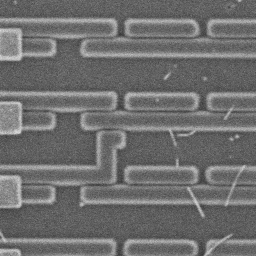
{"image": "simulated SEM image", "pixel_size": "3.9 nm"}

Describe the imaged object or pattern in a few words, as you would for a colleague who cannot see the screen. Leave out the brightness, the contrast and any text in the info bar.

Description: wiring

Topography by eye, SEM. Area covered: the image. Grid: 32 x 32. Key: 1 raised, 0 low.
00000000000000000000000000000000
00000000000000000000000000000000
11111111111000000000000000000000
11111111111111001111111110111111
11111111111111001111111110111111
11111110001111111111111111111111
11111110001111111111111111111111
00000000000000000000000000000000
00000000000000000000000000000000
00000000000000000000000000000000
00000000000000000000000000000000
00000000000000000000000000000000
11111111111111001111111110111111
11111111111111001111111100111111
11111110001111111111111111111111
11111110001111111111111111111111
11000000000011100000000000000000
00000000000011100000000000000000
00000000000011100000000000000000
00000000000011000000000000000000
00000000000011000000000000000000
11111111111111001111111110111111
11111111111111001111111110111111
11111110001111111111111111111111
11111110001111111111111111111111
11100000000000000000000010001000
00000000000000000000000000000000
00000000000000000000000000000000
00000000000000000000000000000000
00000000000000000000000000000000
11111111111111001111111100111111
11111111111111001111111110111111